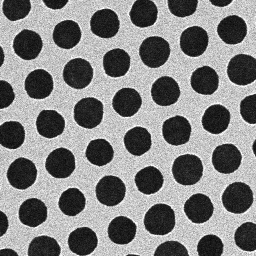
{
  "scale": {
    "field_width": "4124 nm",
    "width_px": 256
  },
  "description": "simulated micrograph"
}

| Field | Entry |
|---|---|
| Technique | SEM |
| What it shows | a regular array of holes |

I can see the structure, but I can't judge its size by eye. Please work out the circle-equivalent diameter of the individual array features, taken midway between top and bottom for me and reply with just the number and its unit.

481 nanometers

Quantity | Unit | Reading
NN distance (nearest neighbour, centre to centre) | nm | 643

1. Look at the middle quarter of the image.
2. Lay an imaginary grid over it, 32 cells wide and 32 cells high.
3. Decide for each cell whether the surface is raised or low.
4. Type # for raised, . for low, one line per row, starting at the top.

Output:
.......###.......####...########
.......###......################
.......###.....#################
.......#################...#####
.......################.....####
#.....################.......###
##############....####.......###
#############......###.......###
#####...####.......###.......###
###......###........###.....####
###.......##.......#####..######
##........###......#############
##........###.....##############
##........################....##
###......################......#
####....#################.......
################.....###........
###############.......###.......
###############.......###......#
#######....####.......####.....#
######......###.......##########
.####.......####.....###########
..###........####...##########..
...###......################....
...###......################....
...#####.############.#####.....
...################.....###.....
..################.......##.....
#########.....####.......###....
#########......###.......###....
########.......###.......#######
....####........###.....########